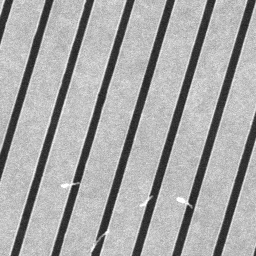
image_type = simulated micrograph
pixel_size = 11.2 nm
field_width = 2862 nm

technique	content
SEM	parallel lines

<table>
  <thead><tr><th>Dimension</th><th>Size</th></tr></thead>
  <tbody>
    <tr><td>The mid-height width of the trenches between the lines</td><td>102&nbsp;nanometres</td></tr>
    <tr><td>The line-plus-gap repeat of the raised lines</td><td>38.8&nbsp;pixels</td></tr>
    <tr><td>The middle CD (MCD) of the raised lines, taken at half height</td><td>335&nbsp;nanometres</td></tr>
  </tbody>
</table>